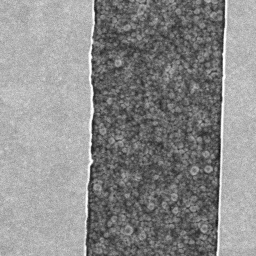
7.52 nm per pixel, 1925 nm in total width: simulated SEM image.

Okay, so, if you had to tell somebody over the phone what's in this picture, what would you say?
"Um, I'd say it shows one or a few lines or trenches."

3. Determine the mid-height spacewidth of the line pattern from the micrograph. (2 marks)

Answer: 985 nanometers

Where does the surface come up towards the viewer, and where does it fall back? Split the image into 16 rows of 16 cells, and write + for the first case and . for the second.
++++++........++
++++++........++
++++++........++
++++++........++
++++++........++
++++++........++
++++++........++
++++++........++
++++++........++
++++++........++
++++++........++
++++++........++
+++++.........++
+++++.........++
+++++.........++
+++++.........++